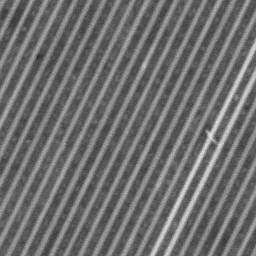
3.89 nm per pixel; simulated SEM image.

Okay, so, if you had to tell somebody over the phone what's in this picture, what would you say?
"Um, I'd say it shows parallel lines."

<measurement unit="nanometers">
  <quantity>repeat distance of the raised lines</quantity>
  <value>50.4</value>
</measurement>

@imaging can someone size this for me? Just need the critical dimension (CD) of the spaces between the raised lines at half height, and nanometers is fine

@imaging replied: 36.3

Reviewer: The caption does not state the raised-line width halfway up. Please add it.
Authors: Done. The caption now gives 3.83 pixels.